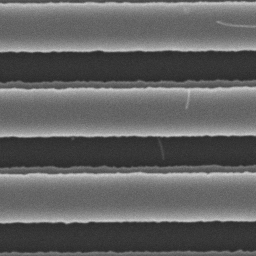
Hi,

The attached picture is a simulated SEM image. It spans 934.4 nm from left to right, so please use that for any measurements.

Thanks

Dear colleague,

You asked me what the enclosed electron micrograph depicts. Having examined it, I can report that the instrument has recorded lines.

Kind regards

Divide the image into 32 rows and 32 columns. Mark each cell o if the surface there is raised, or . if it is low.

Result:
oooooooooooooooooooooooooooooooo
oooooooooooooooooooooooooooooooo
oooooooooooooooooooooooooooooooo
oooooooooooooooooooooooooooooooo
oooooooooooooooooooooooooooooooo
oooooooooooooooooooooooooooooooo
o.oooo..........................
................................
................................
................................
................................
oooooooooooooooooooooooooooooooo
oooooooooooooooooooooooooooooooo
oooooooooooooooooooooooooooooooo
oooooooooooooooooooooooooooooooo
oooooooooooooooooooooooooooooooo
oooooooooooooooooooooooooooooooo
................................
................................
................................
................................
.................o............o.
oooooooooooooooooooooooooooooooo
oooooooooooooooooooooooooooooooo
oooooooooooooooooooooooooooooooo
oooooooooooooooooooooooooooooooo
oooooooooooooooooooooooooooooooo
oooooooooooooooooooooooooooooooo
................................
................................
................................
................................